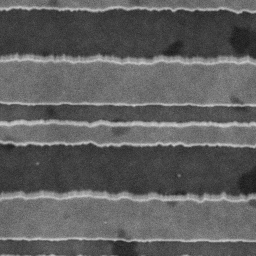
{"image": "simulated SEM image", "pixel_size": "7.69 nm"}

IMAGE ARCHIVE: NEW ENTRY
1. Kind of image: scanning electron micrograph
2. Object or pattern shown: lines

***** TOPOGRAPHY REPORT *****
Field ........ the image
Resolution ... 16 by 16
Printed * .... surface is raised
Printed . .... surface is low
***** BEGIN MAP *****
****************
................
................
................
****************
****************
****************
****************
****************
................
................
................
****************
****************
****************
****************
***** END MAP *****